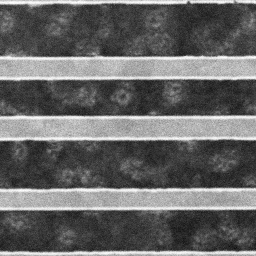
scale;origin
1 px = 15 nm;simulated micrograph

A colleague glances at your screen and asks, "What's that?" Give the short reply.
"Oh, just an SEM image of one or a few lines or trenches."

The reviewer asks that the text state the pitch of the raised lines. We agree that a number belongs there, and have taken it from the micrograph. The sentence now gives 65.5 pixels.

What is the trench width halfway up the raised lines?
0.667 µm